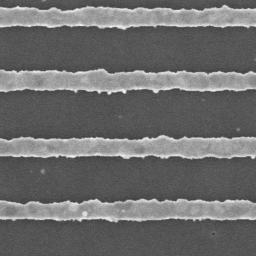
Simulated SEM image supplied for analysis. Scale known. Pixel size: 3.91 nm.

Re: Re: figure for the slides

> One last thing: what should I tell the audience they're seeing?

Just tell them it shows lines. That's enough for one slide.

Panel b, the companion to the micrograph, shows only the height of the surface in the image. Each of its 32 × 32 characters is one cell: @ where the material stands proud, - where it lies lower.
--------------------------------
@@@@@@@@@@@@@@@@@@@@@@@@@@@@@@@@
@@@@@@@@@@@@@@@@@@@@@@@@@@@@@@@@
---------------@----------------
--------------------------------
--------------------------------
--------------------------------
--------------------------------
--------------------------------
@@@@@@@@@@@@@@@@@@@@@@@@@@@@@@@@
@@@@@@@@@@@@@@@@@@@@@@@@@@@@@@@@
-------------@------------------
--------------------------------
--------------------------------
--------------------------------
--------------------------------
--------------------------------
@@@@@@@@@@@@@@@@@@@@@@@@@@@@@@@@
@@@@@@@@@@@@@@@@@@@@@@@@@@@@@@@@
-@@@@@@-@@-----@@@--@@@@@@@@@@@@
--------------------------------
--------------------------------
--------------------------------
--------------------------------
--------------------------------
@@@@@@@@@@@@@@@@@@@@@@@@@@@@@@@@
@@@@@@@@@@@@@@@@@@@@@@@@@@@@@@@@
-------@------@@@@@--------@----
--------------------------------
--------------------------------
--------------------------------
--------------------------------